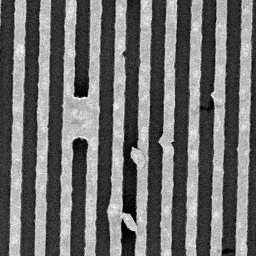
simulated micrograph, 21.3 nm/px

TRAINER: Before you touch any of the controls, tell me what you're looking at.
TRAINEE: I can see parallel lines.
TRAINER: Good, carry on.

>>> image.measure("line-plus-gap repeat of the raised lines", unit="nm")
536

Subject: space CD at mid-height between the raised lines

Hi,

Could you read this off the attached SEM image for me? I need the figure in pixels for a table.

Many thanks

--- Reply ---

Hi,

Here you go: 14.2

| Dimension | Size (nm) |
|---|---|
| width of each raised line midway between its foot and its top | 224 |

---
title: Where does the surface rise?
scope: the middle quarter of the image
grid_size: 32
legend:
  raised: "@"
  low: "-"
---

@@@---@@@----@@----@@----@@@---@
@@@---@@@----@@----@@@---@@@---@
@@@---@@@----@@----@@@---@@@---@
@@@---@@@----@@----@@@---@@@---@
@@----@@@---@@@----@@----@@----@
@@----@@@---@@@----@@----@@@---@
@@----@@@---@@@----@@----@@@---@
@@----@@@---@@@----@@----@@@---@
@@@@@@@@@----@@----@@----@@@---@
@@@@@@@@@---@@@----@@----@@@---@
@@@@@@@@@---@@@----@@----@@@---@
@@@@@@@@@---@@@----@@----@@@---@
@@@@@@@@@---@@@----@@----@@@---@
@@@@@@@@@---@@@----@@----@@@---@
@@@@@@@@----@@@---@@@----@@----@
@@@@@@@@@---@@@----@@----@@----@
@@@@@@@@@---@@@----@@----@@----@
@@@@@@@@----@@@----@@----@@----@
@@@-@@@@@---@@@----@@---@@@----@
@@----@@@---@@@----@@---@@@----@
@@----@@@---@@@----@@---@@@----@
@@----@@----@@@--@@@@----@@@---@
@@----@@----@@@--@@@@----@@----@
@@----@@----@@@--@@@@----@@----@
@@----@@----@@@---@@@----@@----@
@@----@@----@@@---@@@----@@----@
@@----@@----@@@---@@@----@@----@
@@----@@----@@@---@@@----@@----@
@@----@@----@@@---@@@----@@----@
@@----@@----@@@---@@@----@@----@
@@----@@----@@----@@@----@@----@
@@----@@----@@----@@@---@@@----@